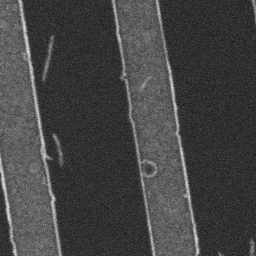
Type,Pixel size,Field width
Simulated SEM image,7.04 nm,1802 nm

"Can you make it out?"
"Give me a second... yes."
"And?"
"one or a few lines or trenches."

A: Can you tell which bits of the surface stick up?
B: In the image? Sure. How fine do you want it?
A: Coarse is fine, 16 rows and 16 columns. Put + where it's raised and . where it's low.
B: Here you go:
.++++++...++++++
.++++++...++++++
..+++++...++++++
..++++++..++++++
..++++++...+++++
..++++++...+++++
..++++++...+++++
..++++++...+++++
...+++++...+++++
...++++++..+++++
...++++++..+++++
...++++++...++++
...++++++...++++
+..++++++...++++
+...+++++...++++
+...++++++..++++